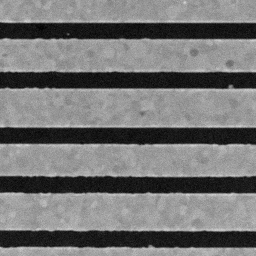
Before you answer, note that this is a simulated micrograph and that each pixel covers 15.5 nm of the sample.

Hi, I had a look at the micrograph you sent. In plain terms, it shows lines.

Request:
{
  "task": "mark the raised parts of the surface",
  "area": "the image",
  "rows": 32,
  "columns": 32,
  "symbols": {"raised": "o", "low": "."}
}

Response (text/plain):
oooooooooooooooooooooooooooooooo
oooooooooooooooooooooooooooooooo
oooooooooooooooooooooooooooooooo
................................
................................
oooooooooooooooooooooooooooooooo
oooooooooooooooooooooooooooooooo
oooooooooooooooooooooooooooooooo
oooooooooooooooooooooooooooooooo
................................
................................
oooooooooooooooooooooooooooooooo
oooooooooooooooooooooooooooooooo
oooooooooooooooooooooooooooooooo
oooooooooooooooooooooooooooooooo
oooooooooooooooooooooooooooooooo
................................
................................
oooooooooooooooooooooooooooooooo
oooooooooooooooooooooooooooooooo
oooooooooooooooooooooooooooooooo
oooooooooooooooooooooooooooooooo
................................
................................
oooooooooooooooooooooooooooooooo
oooooooooooooooooooooooooooooooo
oooooooooooooooooooooooooooooooo
oooooooooooooooooooooooooooooooo
oooooooooooooooooooooooooooooooo
................................
................................
oooooooooooooooooooooooooooooooo